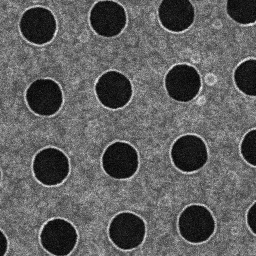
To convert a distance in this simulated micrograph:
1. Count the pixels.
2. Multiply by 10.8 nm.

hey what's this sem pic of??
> a regular array of holes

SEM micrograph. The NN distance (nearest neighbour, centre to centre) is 754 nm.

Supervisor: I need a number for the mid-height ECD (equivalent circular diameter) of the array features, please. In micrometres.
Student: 0.404